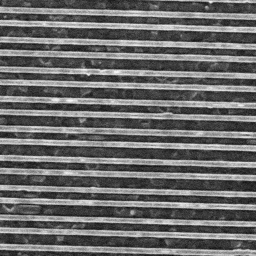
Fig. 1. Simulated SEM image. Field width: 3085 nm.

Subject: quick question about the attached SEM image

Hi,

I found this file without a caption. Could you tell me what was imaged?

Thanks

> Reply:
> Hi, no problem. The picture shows parallel lines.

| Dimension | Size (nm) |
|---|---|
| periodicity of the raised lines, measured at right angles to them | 178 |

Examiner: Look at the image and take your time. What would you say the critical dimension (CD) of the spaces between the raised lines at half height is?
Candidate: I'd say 134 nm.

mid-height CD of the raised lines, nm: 58.7